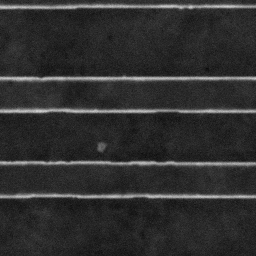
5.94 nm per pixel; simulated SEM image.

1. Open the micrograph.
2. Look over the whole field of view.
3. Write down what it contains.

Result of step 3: lines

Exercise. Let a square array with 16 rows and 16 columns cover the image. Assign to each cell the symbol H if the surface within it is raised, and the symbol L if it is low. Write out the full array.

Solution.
LHHHHLLLLLLLLLLL
LLLLLLLLLLLLLLLL
LLLLLLLLLLLLLLLL
LLLLLLLLLLLLLLLL
LLLLLLLLLLLLLLLL
HHHHHHHHHHHHHHHH
HHHHHHHHHHHHHHHH
LLLLLLLLLLLLLLLL
LLLLLLLLLLLLLLLL
LLLLLLLLLLLLLLLL
HHHHHHHHHHHHHHHH
HHHHHHHHHHHHHHHH
LLLLLLLLLLLLLLLL
LLLLLLLLLLLLLLLL
LLLLLLLLLLLLLLLL
LLLLLLLLLLLLLLLL